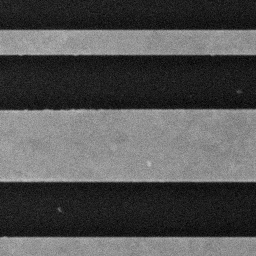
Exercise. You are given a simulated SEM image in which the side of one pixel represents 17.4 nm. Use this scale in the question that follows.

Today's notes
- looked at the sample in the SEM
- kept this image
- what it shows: lines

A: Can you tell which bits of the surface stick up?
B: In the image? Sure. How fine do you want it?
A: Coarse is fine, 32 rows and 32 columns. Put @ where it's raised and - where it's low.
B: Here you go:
--------------------------------
--------------------------------
--------------------------------
--------------------------------
@@@@@@@@@@@@@@@@@@@@@@@@@@@@@@@@
@@@@@@@@@@@@@@@@@@@@@@@@@@@@@@@@
@@@@@@@@@@@@@@@@@@@@@@@@@@@@@@@@
--------------------------------
--------------------------------
--------------------------------
--------------------------------
--------------------------------
--------------------------------
--------------------------------
@@@@@@@@@@@@@@@@@@@@@@@@@@@@@@@@
@@@@@@@@@@@@@@@@@@@@@@@@@@@@@@@@
@@@@@@@@@@@@@@@@@@@@@@@@@@@@@@@@
@@@@@@@@@@@@@@@@@@@@@@@@@@@@@@@@
@@@@@@@@@@@@@@@@@@@@@@@@@@@@@@@@
@@@@@@@@@@@@@@@@@@@@@@@@@@@@@@@@
@@@@@@@@@@@@@@@@@@@@@@@@@@@@@@@@
@@@@@@@@@@@@@@@@@@@@@@@@@@@@@@@@
@@@@@@@@@@@@@@@@@@@@@@@@@@@@@@@@
--------------------------------
--------------------------------
--------------------------------
--------------------------------
--------------------------------
--------------------------------
--------------------------------
@@@@@@@@@@@@@@@@@@@@@@@@@@@@@@@@
@@@@@@@@@@@@@@@@@@@@@@@@@@@@@@@@